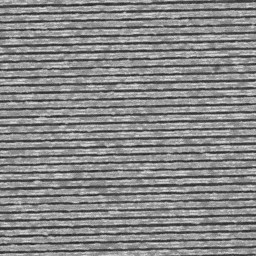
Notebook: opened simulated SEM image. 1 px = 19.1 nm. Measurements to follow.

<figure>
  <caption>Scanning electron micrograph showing parallel lines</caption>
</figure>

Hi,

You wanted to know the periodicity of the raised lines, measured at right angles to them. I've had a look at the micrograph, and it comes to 152 nm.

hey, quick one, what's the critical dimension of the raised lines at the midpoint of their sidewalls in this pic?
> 97.9 nm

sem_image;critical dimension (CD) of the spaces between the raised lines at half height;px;2.75